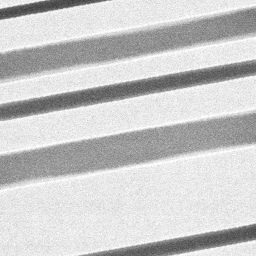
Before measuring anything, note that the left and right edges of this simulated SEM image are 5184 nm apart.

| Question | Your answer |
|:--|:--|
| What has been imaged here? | lines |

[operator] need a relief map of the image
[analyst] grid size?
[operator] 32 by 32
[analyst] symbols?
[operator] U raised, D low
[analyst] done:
UUUDDDDDDDDUUUUUUUUUUUUUUUUUUUUU
DDDDDDUUUUUUUUUUUUUUUUUUUUUDDDDD
UUUUUUUUUUUUUUUUUUUUUUDDDDDDDDDD
UUUUUUUUUUUUUUUUUDDDDDDDDDDDDDDD
UUUUUUUUUUUDDDDDDDDDDDDDDDDDDDDD
UUUUUDDDDDDDDDDDDDDDDDDDDDDUUUUU
DDDDDDDDDDDDDDDDDDDDDUUUUUUUUUUU
DDDDDDDDDDDDDDDDDUUUUUUUUUUUUUUD
DDDDDDDDDDDUUUUUUUUUUUUUUUDDDDDD
DDDDDUUUUUUUUUUUUUUDDDDDDDDDDDDU
UUUUUUUUUUUUUUDDDDDDDDDDDDUUUUUU
UUUUUUUUUDDDDDDDDDDDDUUUUUUUUUUU
UUUDDDDDDDDDDDDUUUUUUUUUUUUUUUUU
DDDDDDDDDDUUUUUUUUUUUUUUUUUUUUUU
DDDDUUUUUUUUUUUUUUUUUUUUUUDDDDDD
UUUUUUUUUUUUUUUUUUUUUDDDDDDDDDDD
UUUUUUUUUUUUUUUDDDDDDDDDDDDDDDDD
UUUUUUUUUDDDDDDDDDDDDDDDDDDDDDDD
UUUUDDDDDDDDDDDDDDDDDDDDDDDDDDUU
DDDDDDDDDDDDDDDDDDDDDDDDDUUUUUUU
DDDDDDDDDDDDDDDDDDDUUUUUUUUUUUUU
DDDDDDDDDDDDDUUUUUUUUUUUUUUUUUUU
DDDDDDDUUUUUUUUUUUUUUUUUUUUUUUUU
DDUUUUUUUUUUUUUUUUUUUUUUUUUUUUUU
UUUUUUUUUUUUUUUUUUUUUUUUUUUUUUUU
UUUUUUUUUUUUUUUUUUUUUUUUUUUUUUUU
UUUUUUUUUUUUUUUUUUUUUUUUUUUUUUUU
UUUUUUUUUUUUUUUUUUUUUUUUUUUUUUUU
UUUUUUUUUUUUUUUUUUUUUUUUUUUUUDDD
UUUUUUUUUUUUUUUUUUUUUUUDDDDDDDDD
UUUUUUUUUUUUUUUUUUDDDDDDDDDDDUUU
UUUUUUUUUUUUDDDDDDDDDDDDUUUUUUUU